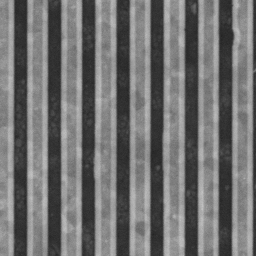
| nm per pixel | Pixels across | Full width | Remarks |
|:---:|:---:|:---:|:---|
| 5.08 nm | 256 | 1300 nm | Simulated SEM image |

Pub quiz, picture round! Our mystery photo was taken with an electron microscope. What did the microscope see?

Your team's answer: parallel lines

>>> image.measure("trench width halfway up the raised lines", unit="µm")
0.0927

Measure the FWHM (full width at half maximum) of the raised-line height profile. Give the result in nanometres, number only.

79.4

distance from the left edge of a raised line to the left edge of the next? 34.2 px